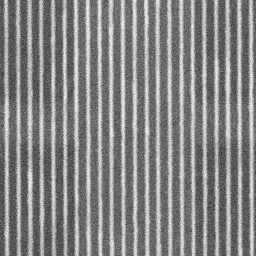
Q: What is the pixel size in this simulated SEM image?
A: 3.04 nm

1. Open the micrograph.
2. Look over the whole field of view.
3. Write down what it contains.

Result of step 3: parallel lines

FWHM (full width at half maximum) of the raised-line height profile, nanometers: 8.4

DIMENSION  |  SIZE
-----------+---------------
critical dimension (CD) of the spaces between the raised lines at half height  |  27.4 nm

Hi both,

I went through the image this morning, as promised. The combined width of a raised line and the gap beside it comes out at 0.0355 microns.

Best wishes